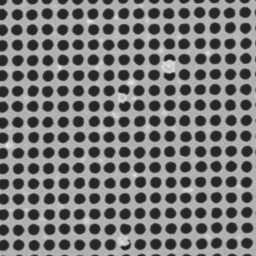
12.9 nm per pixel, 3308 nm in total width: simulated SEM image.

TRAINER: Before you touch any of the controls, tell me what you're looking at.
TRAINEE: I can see a regular array of holes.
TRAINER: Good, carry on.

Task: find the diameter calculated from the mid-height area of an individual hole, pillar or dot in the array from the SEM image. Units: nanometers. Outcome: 148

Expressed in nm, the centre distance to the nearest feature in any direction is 192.